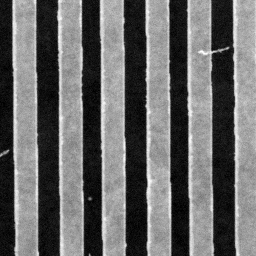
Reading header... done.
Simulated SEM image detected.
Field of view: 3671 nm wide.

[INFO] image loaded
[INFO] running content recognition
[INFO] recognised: lines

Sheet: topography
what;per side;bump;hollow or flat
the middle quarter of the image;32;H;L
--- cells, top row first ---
HHHHLLLLLHHHHHHLLLLLLHHHHHLLLLLH
HHHHLLLLLHHHHHHLLLLLLHHHHHLLLLLH
HHHHLLLLLHHHHHHLLLLLLHHHHHLLLLLH
HHHHLLLLLHHHHHHLLLLLLHHHHHLLLLLH
HHHHLLLLLHHHHHHLLLLLLHHHHHLLLLLH
HHHHLLLLLHHHHHHLLLLLLHHHHHLLLLLH
HHHHLLLLLHHHHHHLLLLLLHHHHHLLLLLH
HHHHLLLLLHHHHHHLLLLLLHHHHHLLLLLH
HHHHLLLLLHHHHHHLLLLLLHHHHHLLLLLH
HHHHHLLLLHHHHHHLLLLLLHHHHHLLLLLH
HHHHHLLLLHHHHHHLLLLLLHHHHHLLLLLH
HHHHHLLLLHHHHHHLLLLLLHHHHHLLLLLH
HHHHHLLLLHHHHHHLLLLLLHHHHHLLLLLH
HHHHHLLLLHHHHHHLLLLLLHHHHHLLLLLH
HHHHHLLLLHHHHHHLLLLLLHHHHHLLLLLH
HHHHHLLLLHHHHHHLLLLLLHHHHHLLLLLH
HHHHHLLLLHHHHHHLLLLLLHHHHHLLLLLH
HHHHHLLLLHHHHHHLLLLLLHHHHHLLLLLH
HHHHHLLLLHHHHHHLLLLLLHHHHHLLLLLH
HHHHHLLLLLHHHHHLLLLLLHHHHHLLLLLH
HHHHHLLLLLHHHHHLLLLLLHHHHHLLLLLH
HHHHHLLLLLHHHHHLLLLLLHHHHHLLLLLH
HHHHHLLLLLHHHHHLLLLLLHHHHHLLLLLH
HHHHHLLLLLHHHHHLLLLLLHHHHHLLLLLH
HHHHHLLLLLHHHHHLLLLLLHHHHHLLLLLH
HHHHHLLLLLHHHHHLLLLLLHHHHHLLLLLH
HHHHHLLLLLHHHHHLLLLLLHHHHHLLLLLH
HHHHHLLLLLHHHHHLLLLLLHHHHHLLLLLH
HHHHHLLLLLHHHHHLLLLLLHHHHHLLLLLH
HHHHHLLLLLHHHHHLLLLLLHHHHHLLLLLH
HHHHHLLLLLHHHHHLLLLLLHHHHHLLLLLH
HHHHHLLLLLHHHHHLLLLLLHHHHHHLLLLH